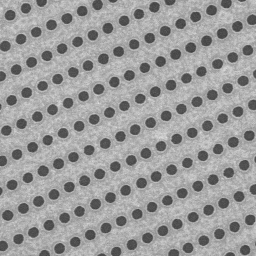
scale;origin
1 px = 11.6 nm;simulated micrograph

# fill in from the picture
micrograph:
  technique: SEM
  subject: a regular array of holes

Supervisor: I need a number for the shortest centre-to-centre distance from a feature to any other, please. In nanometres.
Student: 193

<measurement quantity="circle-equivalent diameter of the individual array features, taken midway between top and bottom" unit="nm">132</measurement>